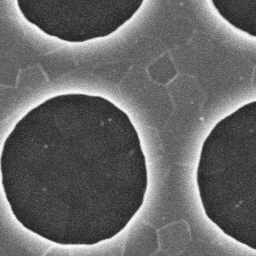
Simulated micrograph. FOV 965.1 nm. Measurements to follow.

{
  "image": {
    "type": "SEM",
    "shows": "holes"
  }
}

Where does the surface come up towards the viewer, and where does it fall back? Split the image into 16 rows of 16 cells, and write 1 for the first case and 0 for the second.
1000000001111000
1100000011111100
1111011111111111
1111111111111111
1111111111111111
1111111111111111
1100000111111110
1000000011111100
1000000001111000
0000000001111000
0000000001110000
0000000001110000
0000000001111000
1000000011111000
1100000111111100
1111111111111111